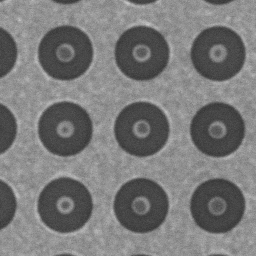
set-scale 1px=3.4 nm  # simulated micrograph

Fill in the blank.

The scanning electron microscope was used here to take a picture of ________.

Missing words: an array of small figures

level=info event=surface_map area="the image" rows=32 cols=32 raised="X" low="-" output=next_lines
XXXXXXX--XXXXXXX---XXXXXXX--XXXX
XXXXXXXXXXXXXXXXXXXXXXXXXXXXXXXX
XXXXXXXXXXXXXXXXXXXXXXXXXXXXXXXX
XXXXXXX---XXXXXX---XXXXXXX---XXX
--XXX------XXXX-----XXXX------XX
--XXX-------XX-------XXX-------X
--XXX--XX---XX---XX--XXX--XX---X
--XXX---X---XX---X---XXX-------X
--XXX------XXXX------XXX------XX
-XXXXX----XXXXXX----XXXXX----XXX
XXXXXXXXXXXXXXXXXXXXXXXXXXXXXXXX
XXXXXXXXXXXXXXXXXXXXXXXXXXXXXXXX
XXXXXXXXXXXXXXXXXXXXXXXXXXXXXXXX
-XXXXX----XXXXX-----XXXXX----XXX
--XXX------XXXX------XXX------XX
--XXX---X---XX---X---XXX---X---X
--XXX--XX---XX---XX--XXX--XX---X
--XXX------XXX-------XXX------XX
-XXXXX-----XXXX------XXXX-----XX
XXXXXXX--XXXXXXX---XXXXXXX---XXX
XXXXXXXXXXXXXXXXXXXXXXXXXXXXXXXX
XXXXXXXXXXXXXXXXXXXXXXXXXXXXXXXX
XXXXXX----XXXXXX---XXXXXXX---XXX
--XXX------XXXX-----XXXX------XX
--XXX-------XX-------XXX-------X
--XXX--XX---XX---XX--XXX--XX---X
--XXX-------XX---X---XXX--XX---X
--XXX------XXXX------XXX------XX
-XXXXX----XXXXXX----XXXXX----XXX
XXXXXXXXXXXXXXXXXXXXXXXXXXXXXXXX
XXXXXXXXXXXXXXXXXXXXXXXXXXXXXXXX
XXXXXXXXXXXXXXXXXXXXXXXXXXX-XXXX